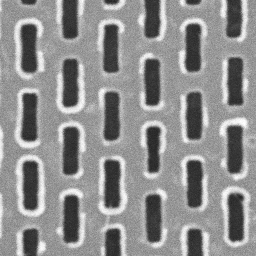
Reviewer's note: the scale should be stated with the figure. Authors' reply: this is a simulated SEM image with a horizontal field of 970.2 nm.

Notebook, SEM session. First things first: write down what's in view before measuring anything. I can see a regular array of holes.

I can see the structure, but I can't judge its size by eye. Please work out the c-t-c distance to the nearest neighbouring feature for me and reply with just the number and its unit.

52.8 px